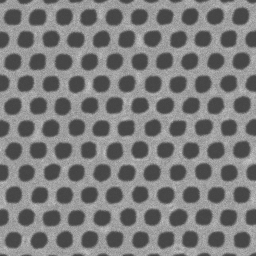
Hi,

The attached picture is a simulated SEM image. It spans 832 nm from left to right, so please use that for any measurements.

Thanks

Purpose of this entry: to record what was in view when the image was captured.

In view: a regular array of holes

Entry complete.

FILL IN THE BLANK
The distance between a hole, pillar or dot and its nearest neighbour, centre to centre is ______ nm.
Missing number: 80.5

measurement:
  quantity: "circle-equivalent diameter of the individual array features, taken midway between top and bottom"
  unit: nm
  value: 55.2